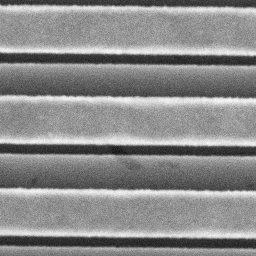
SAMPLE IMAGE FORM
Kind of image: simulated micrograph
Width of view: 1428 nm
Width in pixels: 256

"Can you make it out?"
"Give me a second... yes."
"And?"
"lines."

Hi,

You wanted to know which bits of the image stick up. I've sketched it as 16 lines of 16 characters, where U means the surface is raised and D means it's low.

UUUUUUUUUUUUUUUU
UUUUUUUUUUUUUUUU
UUUUUUUUUUUUUUUU
DDDDDDDDDDDDDDDD
DDDDDDDDDDDDDDDD
DDDDDDDDDDDDDDDD
UUUUUUUUUUUUUUUU
UUUUUUUUUUUUUUUU
UUUUUUUUUUUUUUUU
DDDDDDDDDDDDDDDD
DDDDDDDDDDDDDDDD
DDDDDDDDDDDDDDDD
UUUUUUUUUUUUUUUU
UUUUUUUUUUUUUUUU
UUUUUUUUUUUUUUUU
DDDDDDDDDDDDDDDD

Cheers